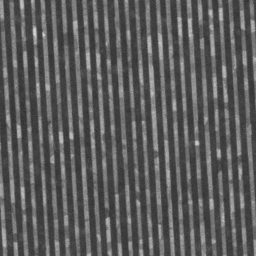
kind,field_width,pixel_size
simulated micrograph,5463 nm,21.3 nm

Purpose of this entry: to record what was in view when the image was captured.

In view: parallel lines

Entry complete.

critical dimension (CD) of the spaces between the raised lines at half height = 141 nm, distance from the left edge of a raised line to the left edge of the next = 222 nm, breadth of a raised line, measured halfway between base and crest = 77.2 nanometers